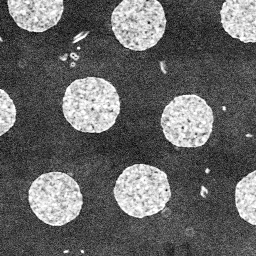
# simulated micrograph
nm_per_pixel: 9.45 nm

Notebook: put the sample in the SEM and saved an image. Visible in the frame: raised bodies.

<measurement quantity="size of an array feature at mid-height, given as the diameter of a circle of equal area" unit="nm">504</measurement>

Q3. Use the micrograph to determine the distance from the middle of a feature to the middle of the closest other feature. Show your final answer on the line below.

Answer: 800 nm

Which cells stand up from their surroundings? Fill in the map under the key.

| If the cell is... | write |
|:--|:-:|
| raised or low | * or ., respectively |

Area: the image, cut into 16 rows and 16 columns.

.***...***....**
.**....***....**
.......***.....*
................
................
....***.........
*...***....**...
*...***...***...
..........***...
................
........**......
..***..****....*
..***..***.....*
..***...*......*
................
................